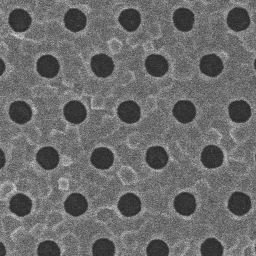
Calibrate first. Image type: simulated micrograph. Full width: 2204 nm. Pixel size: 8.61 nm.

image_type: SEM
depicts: a regular array of holes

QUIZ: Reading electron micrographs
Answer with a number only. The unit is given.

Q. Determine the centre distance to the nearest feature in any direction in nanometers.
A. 457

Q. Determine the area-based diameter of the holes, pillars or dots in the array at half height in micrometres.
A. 0.207